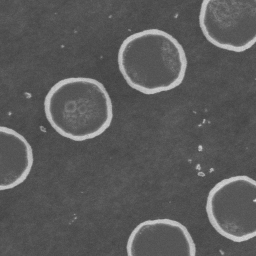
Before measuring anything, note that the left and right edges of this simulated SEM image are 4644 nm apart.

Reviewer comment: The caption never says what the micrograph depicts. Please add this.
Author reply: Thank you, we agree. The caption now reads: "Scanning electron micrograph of raised bodies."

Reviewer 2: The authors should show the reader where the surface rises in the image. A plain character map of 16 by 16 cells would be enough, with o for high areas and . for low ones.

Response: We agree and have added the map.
.............ooo
.............ooo
........ooo..ooo
........ooo.....
........ooo.....
....oo...o......
...oooo.........
...oooo.........
o...oo..........
oo..............
oo..............
o.............oo
.............ooo
.............ooo
........oooo..oo
........oooo....